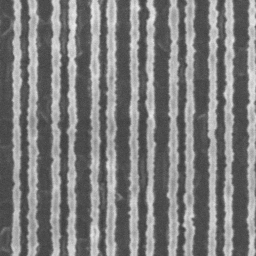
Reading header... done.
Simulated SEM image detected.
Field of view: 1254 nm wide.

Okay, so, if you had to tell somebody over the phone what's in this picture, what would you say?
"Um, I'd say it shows parallel lines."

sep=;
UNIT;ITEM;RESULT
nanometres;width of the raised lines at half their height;36.1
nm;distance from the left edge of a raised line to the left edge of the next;95.4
